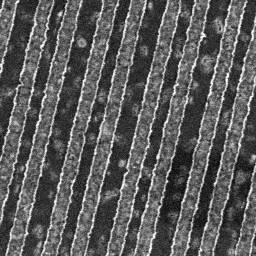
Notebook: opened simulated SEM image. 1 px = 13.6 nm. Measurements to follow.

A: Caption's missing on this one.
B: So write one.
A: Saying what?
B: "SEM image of parallel lines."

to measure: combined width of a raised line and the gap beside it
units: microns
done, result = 0.423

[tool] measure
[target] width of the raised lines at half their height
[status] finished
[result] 14.3 px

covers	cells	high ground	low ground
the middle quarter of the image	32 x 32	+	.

+.....++++...++++.....+++....+++
......+++....+++......+++....+++
.....++++...++++.....++++....+++
.....++++...++++.....++++...++++
.....+++....++++.....++++...++++
.....+++....+++......+++....+++.
....++++....+++.....++++....+++.
....++++...++++.....++++...++++.
....++++...++++.....++++...++++.
....+++....+++......+++....++++.
....+++....+++......+++....+++..
...++++...++++.....++++...++++..
...++++...++++.....++++...++++..
...+++....++++.....++++...++++..
...+++....+++.....++++....+++...
..++++...++++.....++++...++++...
..+++....++++.....++++...++++...
..+++....+++......+++....++++...
..+++....+++.....++++....+++....
.++++...++++.....++++...++++....
.++++...++++.....++++...++++....
.++++...++++.....+++....++++....
.+++....++++.....+++....++++....
++++...++++.....++++....+++.....
++++...++++.....++++...++++.....
++++...++++.....+++....++++.....
+++....+++......+++...+++++.....
+++....+++.....++++...++++......
+++...++++.....++++...++++.....+
++....++++.....+++....++++.....+
++....+++......+++....+++......+
++....+++.....++++...++++......+